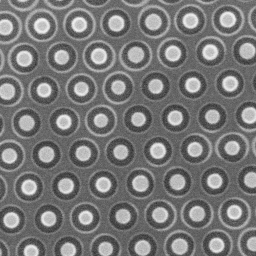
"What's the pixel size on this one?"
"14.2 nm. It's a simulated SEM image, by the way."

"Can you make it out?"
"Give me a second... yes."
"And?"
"an array of small figures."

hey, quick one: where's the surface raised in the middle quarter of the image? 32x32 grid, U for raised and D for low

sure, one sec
DDUUUUDDDDDDUUUDDDDDUUUUUDDDDUUU
DDUUUUUDDDUUUUUUUDDUUUUUUUUUUUUU
UUUUUUUUUUUUDDDUUUUUUDDDDUUUUUDD
UUDDDDDUUUUDDDDDDUUUDDDDDDUUUDDD
UDDDDDDDUUDDDUDDDUUDDDUUDDUUUDDU
UDDUUUDDUUDDUUUDDUUDDUUUDDDUUDDU
DDDUUUDDUUDDUUUDDUUDDDUUDDUUUDDU
UDDDDDDDUUDDDDDDDUUUDDDDDDUUUUDD
UDDDDDDUUUUDDDDDUUUUUDDDDUUUUUUD
UUUDDDUUUUUUDDDUUUUUUUUUUUUUUUUU
UUUUUUUUUDUUUUUUUDDDUUUUUUDDDDUU
DDUUUUUDDDDDUUUUDDDDDUUUUDDDDDDU
DDDUUUDDDDDDDUUDDDUDDDUUDDDUUDDU
UDDDUDDDUUUDDUUDDUUUDDUUDDUUUDDU
UDDDUUDDUUUDDUUDDUUUDDUUDDDUUDDU
UDDDUUDDDUDDDUUDDDDDDDUUUDDDDDDU
DDDUUUDDDDDDUUUUDDDDDUUUUUDDDDUU
DDUUUUUUDDDUUUUUUUUUUUUUUUUUUUUU
UUUUUUUUUUUUUDDUUUUUUUDDDUUUUUDD
UUUDDDDUUUUDDDDDDUUUUDDDDDUUUUDD
UUDDDDDDUUUDDUUDDUUUDDDUDDDUUDDD
UDDUUUDDDUDDDUUUDDUUDDUUUDDUUDDU
UDDUUUDDDUUDDUUUDDUUDDUUUDDUUDDD
UDDDUUDDUUUDDDUDDUUUDDDDDDDUUUDD
UUDDDDDDUUUDDDDDDUUUUDDDDDUUUUUD
UUUDDDDUUUUUUDDDUUUUUUUDUUUUUUUU
UUUUUUUUUUUUUUUUUUDDDUUUUUDDDDUU
DDDUUUUDDDDDUUUUDDDDDDUUUDDDDDDU
DDDDUUUDDDDDDUUUDDUUDDUUUDDUUUDD
UUDDUUDDDUUDDUUDDUUUUDDUUDDUUUDD
UUDDUUDDUUUDDUUUDUUUUDDUUDDUUUDD
UUDDUUUDDUUDDUUUDDDUDDUUUDDDDDDU